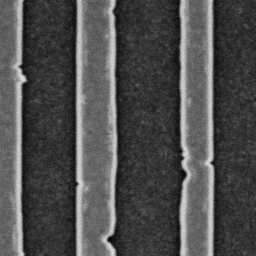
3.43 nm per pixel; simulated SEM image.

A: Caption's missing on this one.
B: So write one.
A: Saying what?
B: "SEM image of one or a few lines or trenches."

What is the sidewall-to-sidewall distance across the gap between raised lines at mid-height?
217 nm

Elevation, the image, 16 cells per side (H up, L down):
HLLLLHHLLLLHHLLL
HLLLLHHLLLLHHLLL
HLLLLHHLLLLHHLLL
HLLLLHHLLLLHHLLL
HLLLLHHLLLLHHLLL
HLLLLHHLLLLHHLLL
HLLLLHHLLLLHHLLL
HLLLLHHLLLLHHLLL
HLLLLHHLLLLHHLLL
HLLLLHHLLLLHHLLL
HLLLLHHLLLLLHLLL
HLLLLHHLLLLLHLLL
HLLLLHHLLLLHHLLL
HLLLLHHLLLLHHLLL
HLLLLHHLLLLHHLLL
HLLLLHHLLLLHHLLL